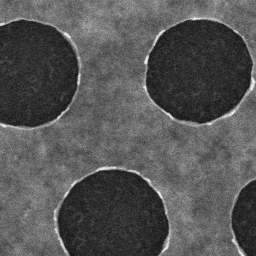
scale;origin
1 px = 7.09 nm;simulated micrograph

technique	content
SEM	holes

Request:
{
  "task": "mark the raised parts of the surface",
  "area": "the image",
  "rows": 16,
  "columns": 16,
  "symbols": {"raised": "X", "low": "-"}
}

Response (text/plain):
XXXXXXXXXXXXXXXX
---XXXXXXXX---XX
----XXXXXX-----X
-----XXXX-------
-----XXXX-------
-----XXXX-------
----XXXXXX-----X
---XXXXXXXX--XXX
XXXXXXXXXXXXXXXX
XXXXXXXXXXXXXXXX
XXXXXXXXXXXXXXXX
XXXXX----XXXXXXX
XXXX------XXXXX-
XXXX------XXXX--
XXXX-------XXXX-
XXXX------XXXXX-